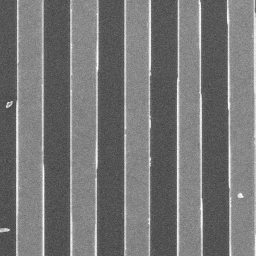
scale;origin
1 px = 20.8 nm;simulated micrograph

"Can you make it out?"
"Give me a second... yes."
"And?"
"lines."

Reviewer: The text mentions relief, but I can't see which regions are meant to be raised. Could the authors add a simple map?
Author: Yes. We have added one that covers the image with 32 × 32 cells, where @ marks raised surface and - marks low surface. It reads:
--@@@----@@@----@@@---@@@---@@@@
--@@@----@@@----@@@---@@@---@@@@
--@@@----@@@----@@@---@@@---@@@@
--@@@----@@@----@@@---@@@----@@@
--@@@----@@@----@@@---@@@----@@@
--@@@----@@@----@@@---@@@----@@@
--@@@----@@@----@@@---@@@----@@@
--@@@----@@@----@@@---@@@----@@@
--@@@----@@@----@@@---@@@----@@@
--@@@----@@@----@@@---@@@----@@@
--@@@----@@@----@@@---@@@----@@@
--@@@----@@@----@@@---@@@----@@@
--@@@----@@@----@@@---@@@----@@@
--@@@----@@@----@@@---@@@----@@@
--@@@----@@@----@@@---@@@----@@@
--@@@----@@@----@@@---@@@----@@@
--@@@----@@@----@@@---@@@----@@@
--@@@----@@@----@@@---@@@----@@@
--@@@----@@@----@@@---@@@----@@@
--@@@----@@@----@@@---@@@----@@@
--@@@----@@@----@@@---@@@----@@@
--@@@----@@@----@@@---@@@----@@@
--@@@----@@@----@@@---@@@----@@@
--@@@----@@@----@@@---@@@----@@@
--@@@----@@@----@@@---@@@----@@@
--@@@----@@@----@@@---@@@----@@@
--@@@----@@@----@@@---@@@----@@@
--@@@----@@@----@@@---@@@----@@@
--@@@----@@@----@@@---@@@----@@@
--@@@----@@@----@@@---@@@----@@@
--@@@----@@@----@@@---@@@----@@@
--@@@----@@@----@@@---@@@----@@@